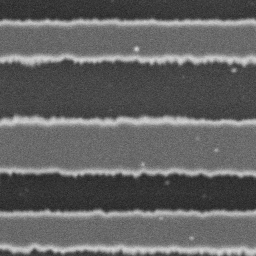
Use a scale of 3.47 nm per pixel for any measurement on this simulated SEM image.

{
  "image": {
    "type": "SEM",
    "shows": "lines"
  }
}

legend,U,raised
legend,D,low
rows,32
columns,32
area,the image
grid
DDDDDDDDDDDDDDDDDDDDDDDDDDDDDDDD
DDDDDDDDDDDDDDDDDDDDDDDDDDDDDDDD
DDDDDDDDDDDDDDDDDDDDDDDDDDDDDDDD
UUUUUUUUUUUUUUUUUUUUUUUUUUUUUUUU
UUUUUUUUUUUUUUUUUUUUUUUUUUUUUUUU
UUUUUUUUUUUUUUUUUUUUUUUUUUUUUUUU
UUUUUUUUUUUUUUUUUUUUUUUUUUUUUUUU
UDDUDDDDDUUUUDDDDUUUDDUDUUDDUUUD
DDDDDDDDDDDDDDDDDDDDDDDDDDDDDDDD
DDDDDDDDDDDDDDDDDDDDDDDDDDDDDDDD
DDDDDDDDDDDDDDDDDDDDDDDDDDDDDDDD
DDDDDDDDDDDDDDDDDDDDDDDDDDDDDDDD
DDDDDDDDDDDDDDDDDDDDDDDDDDDDDDDD
DDDDDDDDDDDDDDDDDDDDDDDDDDDDDDDD
DDDDDDDDDDDDDDDDDDDDDDDDDDDDDDDD
UUUUUUUUUUUUUUUUUUUUUUUUUUUUUUUU
UUUUUUUUUUUUUUUUUUUUUUUUUUUUUUUU
UUUUUUUUUUUUUUUUUUUUUUUUUUUUUUUU
UUUUUUUUUUUUUUUUUUUUUUUUUUUUUUUU
UUUUUUUUUUUUUUUUUUUUUUUUUUUUUUUU
UUUUUUUUUUUUUUUUUUUUUUUUUUUUUUUU
DUUUUUDUUUUUUUUUUUUUUUUUUUUUUUUU
DDDDDDDDDDDDDDDDDDDDDDDDDDDDDDDD
DDDDDDDDDDDDDDDDDDDDDDDDDDDDDDDD
DDDDDDDDDDDDDDDDDDDDDDDDDDDDDDDD
DDDDDDDDDDDDDDDDDDDDDDDDDDDDDDDD
DDDDDDDDDDDDUDDDDUDDUDUDDDDUDDDD
UUUUUUUUUUUUUUUUUUUUUUUUUUUUUUUU
UUUUUUUUUUUUUUUUUUUUUUUUUUUUUUUU
UUUUUUUUUUUUUUUUUUUUUUUUUUUUUUUU
UUUUUUUUUUUUUUUUUUUUUUUUUUUUUUUU
DDDDDDDDDDDDDDDDDDDDDDDDDDDUDDDU